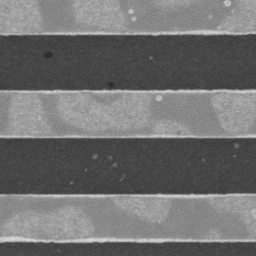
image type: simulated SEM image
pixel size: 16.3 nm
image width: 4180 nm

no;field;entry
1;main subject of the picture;lines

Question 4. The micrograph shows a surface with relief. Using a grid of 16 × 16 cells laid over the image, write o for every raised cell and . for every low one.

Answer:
oooooooooooooooo
oooooooooooooooo
................
................
................
................
oooooooooooooooo
oooooooooooooooo
oooooooooooooooo
................
................
................
oooooooooooooooo
oooooooooooooooo
oooooooooooooooo
................